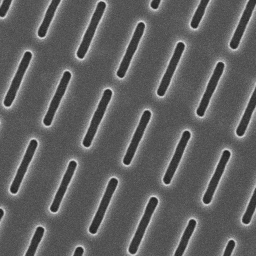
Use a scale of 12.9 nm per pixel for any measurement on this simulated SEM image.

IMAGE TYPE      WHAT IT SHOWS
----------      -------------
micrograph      a regular array of holes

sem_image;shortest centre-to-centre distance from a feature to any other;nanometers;572